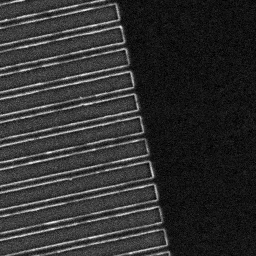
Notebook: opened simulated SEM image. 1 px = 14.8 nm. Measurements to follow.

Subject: parallel lines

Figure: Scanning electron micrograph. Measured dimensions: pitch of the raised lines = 340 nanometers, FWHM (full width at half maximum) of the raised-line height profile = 110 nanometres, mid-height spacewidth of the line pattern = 227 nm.